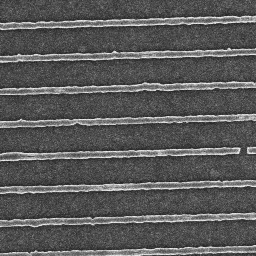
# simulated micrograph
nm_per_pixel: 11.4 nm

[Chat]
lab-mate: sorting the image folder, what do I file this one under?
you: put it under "parallel lines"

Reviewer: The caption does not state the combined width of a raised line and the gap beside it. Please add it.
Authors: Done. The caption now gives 0.376 micrometres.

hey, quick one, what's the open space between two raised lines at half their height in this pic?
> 309 nm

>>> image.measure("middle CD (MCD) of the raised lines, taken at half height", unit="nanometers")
67.2